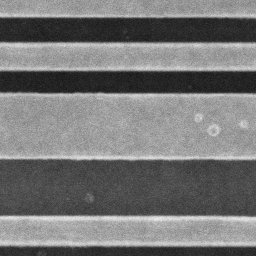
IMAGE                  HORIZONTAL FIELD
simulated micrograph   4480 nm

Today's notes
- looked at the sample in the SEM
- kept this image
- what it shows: lines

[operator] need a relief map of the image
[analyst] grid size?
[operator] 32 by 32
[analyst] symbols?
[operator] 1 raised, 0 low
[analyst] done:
11111111111111111111111111111111
11111111111111111111111111111111
00000000000000000000000000000000
00000000000000000000000000000000
00000000000000000000000000000000
11111111111111111111111111111111
11111111111111111111111111111111
11111111111111111111111111111111
11111111111111111111111111111111
00000000000000000000000000000000
00000000000000000000000000000000
00000000000000000000000000000000
11111111111111111111111111111111
11111111111111111111111111111111
11111111111111111111111111111111
11111111111111111111111111111111
11111111111111111111111111111111
11111111111111111111111111111111
11111111111111111111111111111111
11111111111111111111111111111111
00000000000000000000000000000000
00000000000000000000000000000000
00000000000000000000000000000000
00000000000000000000000000000000
00000000000000000000000000000000
00000000000000000000000000000000
00000000000000000000000000000000
11111111111111111111111111111111
11111111111111111111111111111111
11111111111111111111111111111111
11111111111111111111111111111111
00000000000000000000000000000000